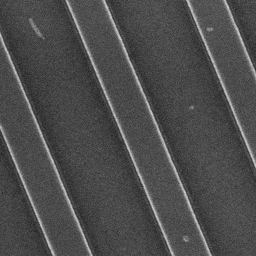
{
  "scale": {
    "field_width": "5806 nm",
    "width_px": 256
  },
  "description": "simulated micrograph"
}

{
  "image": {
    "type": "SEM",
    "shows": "lines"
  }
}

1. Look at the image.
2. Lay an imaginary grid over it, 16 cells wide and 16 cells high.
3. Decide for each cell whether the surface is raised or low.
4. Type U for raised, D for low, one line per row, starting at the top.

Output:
DDDDUUUDDDDDUUDD
DDDDDUUDDDDDUUUD
DDDDDUUUDDDDDUUD
UDDDDDUUDDDDDUUU
UDDDDDUUDDDDDDUU
UDDDDDUUUDDDDDUU
UUDDDDDUUDDDDDUU
UUDDDDDUUUDDDDDU
UUUDDDDDUUDDDDDU
DUUDDDDDUUDDDDDD
DUUUDDDDUUUDDDDD
DUUUDDDDDUUDDDDD
DDUUDDDDDUUUDDDD
DDUUUDDDDDUUDDDD
DDDUUDDDDDUUUDDD
DDDUUUDDDDDUUDDD